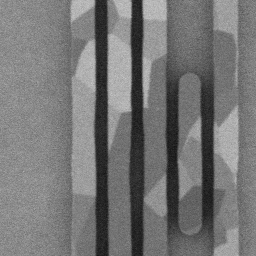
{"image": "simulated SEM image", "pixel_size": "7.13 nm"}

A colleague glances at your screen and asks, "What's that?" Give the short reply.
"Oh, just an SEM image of groups of lines, slits or small figures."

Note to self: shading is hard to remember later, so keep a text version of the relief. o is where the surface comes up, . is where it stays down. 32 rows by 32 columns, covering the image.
.........ooo.ooo..ooo......ooo..
.........ooo.ooo..ooo......ooo..
.........ooo..oo..ooo......ooo..
.........ooo..oo..ooo......ooo..
.........ooo..oo..ooo......ooo..
.........ooo..oo..ooo......ooo..
.........ooo..oo..ooo......ooo..
.........ooo..oo..ooo......ooo..
.........ooo..oo..ooo......ooo..
.........ooo..oo..ooo..oo..ooo..
.........ooo..oo..ooo.ooo..ooo..
.........ooo..oo..ooo.ooo..ooo..
.........ooo..oo..ooo.ooo..ooo..
.........ooo..oo..ooo.ooo..ooo..
.........ooo..oo..ooo.ooo..ooo..
.........ooo..oo..ooo.ooo..ooo..
.........ooo..oo..ooo.ooo..ooo..
.........ooo..oo..ooo.ooo..ooo..
.........ooo..oo..ooo.ooo..ooo..
.........ooo..oo..ooo.ooo..ooo..
.........ooo..oo..ooo.ooo..ooo..
.........ooo..oo..ooo.ooo..ooo..
.........ooo..oo..ooo.ooo..oo...
.........ooo..oo..ooo.ooo..oo...
.........ooo..oo..ooo.ooo..ooo..
.........ooo..oo..ooo.ooo..ooo..
.........ooo..oo..ooo.ooo..ooo..
.........ooo..oo..ooo.ooo..ooo..
.........ooo..oo..ooo..oo..ooo..
.........ooo..oo..ooo......ooo..
.........ooo..oo..ooo......ooo..
.........ooo..oo..ooo......ooo..